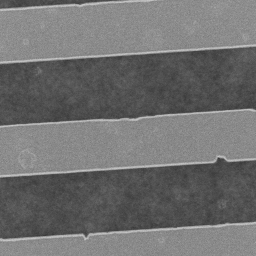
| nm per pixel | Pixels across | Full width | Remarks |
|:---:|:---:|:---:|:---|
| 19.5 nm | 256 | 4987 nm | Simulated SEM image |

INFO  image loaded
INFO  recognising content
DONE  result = one or a few lines or trenches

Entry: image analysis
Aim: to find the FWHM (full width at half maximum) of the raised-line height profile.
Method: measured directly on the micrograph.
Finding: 965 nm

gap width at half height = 1260 nanometres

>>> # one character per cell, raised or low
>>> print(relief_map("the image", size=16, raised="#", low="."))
..##############
################
################
######..........
................
................
................
.......#########
################
################
#######.........
................
................
................
........########
################